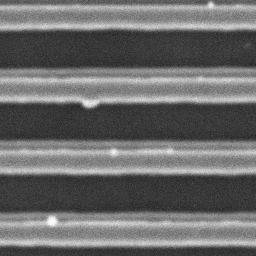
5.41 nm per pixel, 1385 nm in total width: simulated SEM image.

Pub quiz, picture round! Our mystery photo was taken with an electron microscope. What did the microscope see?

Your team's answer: lines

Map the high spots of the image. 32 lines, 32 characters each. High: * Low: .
********************************
********************************
********************************
****.**...**.....***.......***..
................................
................................
................................
................................
................................
********************************
********************************
********************************
..**.*****************..*******.
................................
................................
................................
................................
................................
********************************
********************************
********************************
.**...*.********....**********.*
................................
................................
................................
................................
................................
********************************
********************************
********************************
..***.**************************
................................